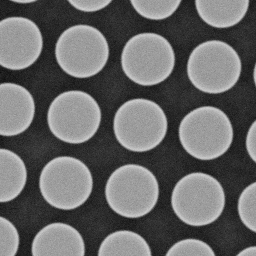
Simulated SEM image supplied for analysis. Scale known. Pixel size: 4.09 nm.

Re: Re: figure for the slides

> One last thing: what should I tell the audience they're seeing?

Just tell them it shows an array of small figures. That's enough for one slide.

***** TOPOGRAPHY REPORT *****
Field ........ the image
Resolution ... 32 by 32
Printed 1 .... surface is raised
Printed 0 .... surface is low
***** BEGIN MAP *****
00000000011110000111110011111110
00000000000000000111110001111110
11110000000000000000000001111100
11111000011100000000000000000000
11111000111110000111000000000000
11111001111110001111100001110000
11111001111111011111110011111000
11110001111110011111110011111100
01100000111110011111110111111100
00000000011000001111100011111100
11000000000000000010000011111000
11100000110000000000000000110000
11110001111100000100000000000000
11110011111100011111000001100000
11110011111110111111100111110000
11110011111100111111100111111000
11100001111100111111101111111001
00000000111000011111000111111001
00000000000000001110000111110001
11000000000000000000000011100001
11100011110000000000000000000000
11100111111000111110000000000000
11100111111000111110000111100000
11100111111001111111001111110001
11000111111001111111001111110011
00000011110000111110001111110011
00000000000000011110001111110011
10000000000000000000000111100011
11000011100000000000000000000001
11000111110000111000000000000000
11001111110001111100001111000000
11001111110011111110011111100011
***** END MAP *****